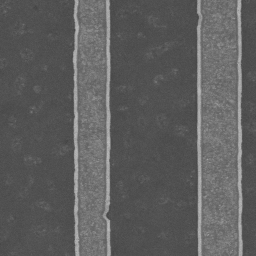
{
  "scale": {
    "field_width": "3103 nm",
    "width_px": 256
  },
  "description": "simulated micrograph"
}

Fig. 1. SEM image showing one or a few lines or trenches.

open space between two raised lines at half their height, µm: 1.1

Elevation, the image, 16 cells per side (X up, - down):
-----XX-----XXX-
-----XX-----XXX-
-----XX-----XXX-
-----XX-----XXX-
-----XX-----XXX-
-----XX-----XXX-
-----XX-----XXX-
-----XX-----XXX-
-----XX-----XXX-
-----XX-----XXX-
-----XX------XX-
-----XX------XX-
-----XX------XX-
-----XX-----XXX-
-----XX-----XXX-
-----XX------XX-